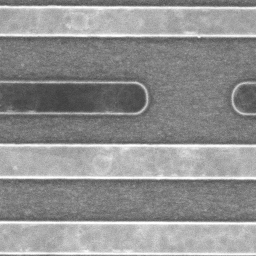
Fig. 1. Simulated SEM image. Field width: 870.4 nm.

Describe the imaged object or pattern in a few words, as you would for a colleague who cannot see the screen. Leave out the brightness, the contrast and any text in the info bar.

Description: one or a few lines or trenches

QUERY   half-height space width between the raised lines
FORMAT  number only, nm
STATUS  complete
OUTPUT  151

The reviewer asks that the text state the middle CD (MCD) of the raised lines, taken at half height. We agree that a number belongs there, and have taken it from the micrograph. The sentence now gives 108 nm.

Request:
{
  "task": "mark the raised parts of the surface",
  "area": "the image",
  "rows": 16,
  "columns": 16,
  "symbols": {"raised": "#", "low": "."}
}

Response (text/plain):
#############...
################
................
................
................
#########......#
#########......#
................
................
################
################
................
................
................
################
################